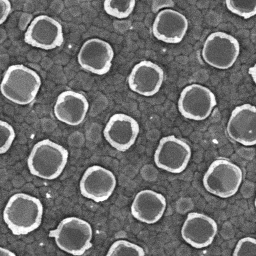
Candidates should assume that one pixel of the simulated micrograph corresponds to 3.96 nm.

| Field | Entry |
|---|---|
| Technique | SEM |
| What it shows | a regular array of raised bodies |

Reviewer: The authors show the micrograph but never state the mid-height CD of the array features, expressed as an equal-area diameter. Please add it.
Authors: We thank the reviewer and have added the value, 136 nanometres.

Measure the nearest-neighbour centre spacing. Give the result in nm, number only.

220